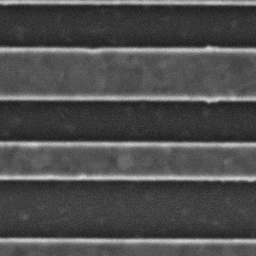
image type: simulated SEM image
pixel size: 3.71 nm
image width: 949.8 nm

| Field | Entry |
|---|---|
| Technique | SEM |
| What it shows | one or a few lines or trenches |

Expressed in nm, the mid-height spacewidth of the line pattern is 173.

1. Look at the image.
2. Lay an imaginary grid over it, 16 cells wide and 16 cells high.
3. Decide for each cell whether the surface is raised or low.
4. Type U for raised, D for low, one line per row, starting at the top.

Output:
DDDDDDDDDDDDDDDD
DDDDDDDDDDDDDDDD
DDDDDDDDDDDDDDDD
UUUUUUUUUUUUUUUU
UUUUUUUUUUUUUUUU
UUUUUUUUUUUUUUUU
DDDDDDDDDDDDDDDD
DDDDDDDDDDDDDDDD
DDDDDDDDDDDDDDDD
UUUUUUUUUUUUUUUU
UUUUUUUUUUUUUUUU
DDDDDDDDDDDDDDDD
DDDDDDDDDDDDDDDD
DDDDDDDDDDDDDDDD
DDDDDDDDDDDDDDDD
UUUUUUUUUUUUUUUU